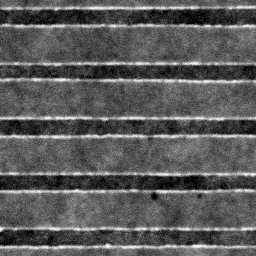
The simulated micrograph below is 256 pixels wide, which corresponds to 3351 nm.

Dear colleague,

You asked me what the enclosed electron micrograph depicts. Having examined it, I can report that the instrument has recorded lines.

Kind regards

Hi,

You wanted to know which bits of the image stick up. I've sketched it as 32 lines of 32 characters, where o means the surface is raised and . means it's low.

oooooooooooooooooooooooooooooooo
................................
................................
oooooooooooooooooooooooooooooooo
oooooooooooooooooooooooooooooooo
oooooooooooooooooooooooooooooooo
oooooooooooooooooooooooooooooooo
oooooooooooooooooooooooooooooooo
................................
................................
oooooooooooooooooooooooooooooooo
oooooooooooooooooooooooooooooooo
oooooooooooooooooooooooooooooooo
oooooooooooooooooooooooooooooooo
oooooooooooooooooooooooooooooooo
................................
................................
oooooooooooooooooooooooooooooooo
oooooooooooooooooooooooooooooooo
oooooooooooooooooooooooooooooooo
oooooooooooooooooooooooooooooooo
oooooooooooooooooooooooooooooooo
................................
................................
oooooooooooooooooooooooooooooooo
oooooooooooooooooooooooooooooooo
oooooooooooooooooooooooooooooooo
oooooooooooooooooooooooooooooooo
oooooooooooooooooooooooooooooooo
................................
................................
oooooooooooooooooooooooooooooooo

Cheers